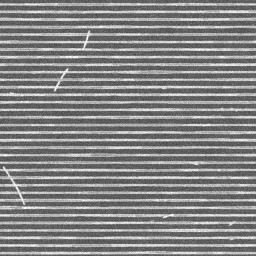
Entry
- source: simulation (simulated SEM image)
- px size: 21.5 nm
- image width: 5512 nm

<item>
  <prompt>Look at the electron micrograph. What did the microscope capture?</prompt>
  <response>parallel lines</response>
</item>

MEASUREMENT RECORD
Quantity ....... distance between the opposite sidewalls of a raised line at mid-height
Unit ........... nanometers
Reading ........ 35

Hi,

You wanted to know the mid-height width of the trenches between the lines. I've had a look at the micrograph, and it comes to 129 nanometres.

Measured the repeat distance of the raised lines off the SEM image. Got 162 nanometers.